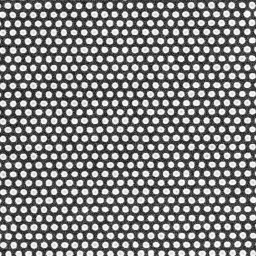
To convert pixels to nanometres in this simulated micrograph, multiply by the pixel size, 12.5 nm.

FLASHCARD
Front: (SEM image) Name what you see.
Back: a regular array of raised bodies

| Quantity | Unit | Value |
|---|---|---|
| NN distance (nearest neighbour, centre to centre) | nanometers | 124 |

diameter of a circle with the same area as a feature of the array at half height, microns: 0.0721